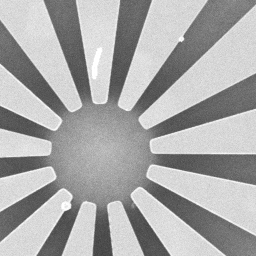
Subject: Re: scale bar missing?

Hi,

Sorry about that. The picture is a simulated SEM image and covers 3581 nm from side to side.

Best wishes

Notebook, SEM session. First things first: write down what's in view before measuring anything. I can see groups of lines, slits or small figures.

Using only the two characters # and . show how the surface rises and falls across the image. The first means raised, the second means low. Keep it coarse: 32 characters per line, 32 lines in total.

######....#####....#######......
######....#####....######......#
######....#####...######......##
.######...####....######.....###
..#####...####....#####.....####
..#####...####...#####.....#####
...#####...###...####.....######
....####...###...####....#######
.....####..###..####....########
##...####..###..###....########.
###...###..###..###...#######...
####...###.###.###...######.....
#####...##..#..##...#####.......
.#####..##.....#...####.........
...####...........###........###
.....###..........##.....#######
##....................##########
######.............#############
######.............#############
####............................
................................
...####...........######........
#######............##########...
#####................###########
###....##.......###....#########
##....###.##..#..###....########
....####..##..##..###.....######
...####..###..##..#####.....####
..#####..###..###..#####......##
.#####...###..###...#####.......
#####...####..###...######......
#####...####..####...#######....